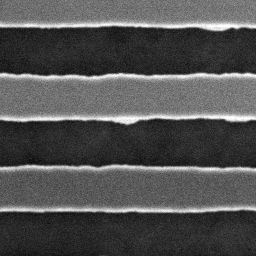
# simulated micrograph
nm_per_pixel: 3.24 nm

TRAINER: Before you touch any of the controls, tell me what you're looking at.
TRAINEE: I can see lines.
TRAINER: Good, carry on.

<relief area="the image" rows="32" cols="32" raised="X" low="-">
XXXXXXXXXXXXXXXXXXXXXXXXXXXXXXXX
XXXXXXXXXXXXXXXXXXXXXXXXXXXXXXXX
XXXXXXXXXXXXXXXXXXXXXXXXXXXXXXXX
--------------------------------
--------------------------------
--------------------------------
--------------------------------
--------------------------------
--------------------------------
XXXXX-X-XX---XXXXX-XXXXXXXXXXXXX
XXXXXXXXXXXXXXXXXXXXXXXXXXXXXXXX
XXXXXXXXXXXXXXXXXXXXXXXXXXXXXXXX
XXXXXXXXXXXXXXXXXXXXXXXXXXXXXXXX
XXXXXXXXXXXXXXXXXXXXXXXXXXXXXXXX
XXXXXXXXXXXXXXXXXXXXXXXXXXXXXXXX
--------------------------------
--------------------------------
--------------------------------
--------------------------------
--------------------------------
--------------------------------
XXXXXXXXXXXXXXXXXXXXXXXXXXXXXXXX
XXXXXXXXXXXXXXXXXXXXXXXXXXXXXXXX
XXXXXXXXXXXXXXXXXXXXXXXXXXXXXXXX
XXXXXXXXXXXXXXXXXXXXXXXXXXXXXXXX
XXXXXXXXXXXXXXXXXXXXXXXXXXXXXXXX
--------------------------------
--------------------------------
--------------------------------
--------------------------------
--------------------------------
--------------------------------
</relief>